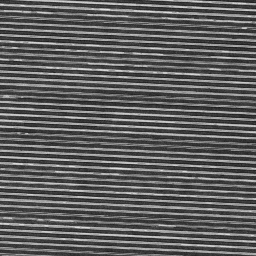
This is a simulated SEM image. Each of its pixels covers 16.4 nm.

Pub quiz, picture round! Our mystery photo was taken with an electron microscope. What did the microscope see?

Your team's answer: parallel lines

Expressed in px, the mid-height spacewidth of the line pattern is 4.5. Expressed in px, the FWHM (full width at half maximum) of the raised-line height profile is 1.75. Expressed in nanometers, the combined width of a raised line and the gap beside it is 99.4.